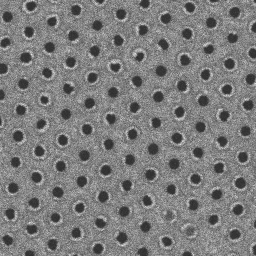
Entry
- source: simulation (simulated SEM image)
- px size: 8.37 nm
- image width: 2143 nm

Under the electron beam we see a regular array of holes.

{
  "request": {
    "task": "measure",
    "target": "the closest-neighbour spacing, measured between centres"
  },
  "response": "215 nanometers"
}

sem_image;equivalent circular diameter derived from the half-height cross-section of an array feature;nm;85.5